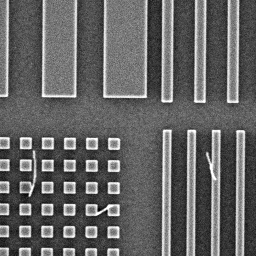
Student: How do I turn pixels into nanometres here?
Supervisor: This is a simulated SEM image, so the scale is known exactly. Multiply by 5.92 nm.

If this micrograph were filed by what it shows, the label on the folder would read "groups of lines, slits or small figures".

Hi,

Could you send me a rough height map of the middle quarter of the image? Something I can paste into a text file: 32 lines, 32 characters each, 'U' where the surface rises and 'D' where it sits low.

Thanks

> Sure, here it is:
UUUDDDDDDDUUUUUUUUUUUDDDDUUDDDDD
UUUDDDDDDDUUUUUUUUUUUDDDDUUDDDDD
UUUDDDDDDDUUUUUUUUUUUDDDDUUDDDDD
UUUDDDDDDDUUUUUUUUUUUDDDDUUDDDDD
UUUDDDDDDDUUUUUUUUUUUDDDDUUDDDDD
UUUDDDDDDDUUUUUUUUUUUDDDDUUDDDDD
UUUDDDDDDDUUUUUUUUUUUDDDDUUDDDDD
UUUDDDDDDDUUUUUUUUUUUDDDDUUDDDDD
DDDDDDDDDDDDDDDDDDDDDDDDDUUDDDDD
DDDDDDDDDDDDDDDDDDDDDDDDDDDDDDDD
DDDDDDDDDDDDDDDDDDDDDDDDDDDDDDDD
DDDDDDDDDDDDDDDDDDDDDDDDDDDDDDDD
DDDDDDDDDDDDDDDDDDDDDDDDDDDDDDDD
DDDDDDDDDDDDDDDDDDDDDDDDDDDDDDDD
DDDDDDDDDDDDDDDDDDDDDDDDDDDDDDDD
DDDDDDDDDDDDDDDDDDDDDDDDDDDDDDDD
DDDDDDDDDDDDDDDDDDDDDDDDDDDDDDDD
DDDDDDDDDDDDDDDDDDDDDDDDDUUDDDDU
DDDDDDDDDDDDDDDDDDDDDDDDDUUDDDDU
UUUDDDUUDDDUUUDDDDDDDDDDDUUDDDDU
UUUDDDUUDDDUUUDDDDDDDDDDDUUDDDDU
DDDDDDDDDDDDDDDDDDDDDDDDDUUDDDDU
DDDDDDDDDDDDDDDDDDDDDDDDDUUDDDDU
DDDDDDDDDDDDDDDDDDDDDDDDDUUDDDDU
UUUDDDUUDDDUUUDDDDDDDDDDDUUDDDDU
UUUDDDUUDDDUUUDDDDDDDDDDDUUDDDDU
UUUDDDUUDDDUUUDDDDDDDDDDDUUDDDDU
DDDDDDDDDDDDDDDDDDDDDDDDDUDDDDDU
DDDDDDDDDDDDDDDDDDDDDDDDDUDDDDDU
DDDDDDDDDDDDDDDDDDDDDDDDDUDDDDDU
UUUDDDUUDDDUUUDDDDDDDDDDDUDDDDDU
UUUDDDUUDDDUUUDDDDDDDDDDDUDDDDDU